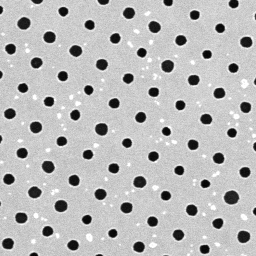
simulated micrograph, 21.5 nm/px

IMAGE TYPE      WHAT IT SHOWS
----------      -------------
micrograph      a regular array of holes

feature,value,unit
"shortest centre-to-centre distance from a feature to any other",618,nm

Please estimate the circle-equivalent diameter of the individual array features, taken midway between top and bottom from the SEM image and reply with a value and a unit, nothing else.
246 nanometers